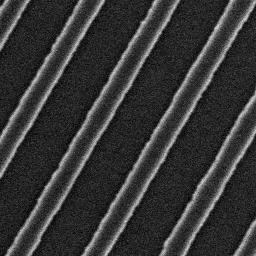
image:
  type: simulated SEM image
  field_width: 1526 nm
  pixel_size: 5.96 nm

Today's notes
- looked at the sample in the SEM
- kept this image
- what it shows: lines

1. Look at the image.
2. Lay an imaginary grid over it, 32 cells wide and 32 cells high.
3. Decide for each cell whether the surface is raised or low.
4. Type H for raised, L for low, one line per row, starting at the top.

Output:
HHHLLLLLLLHHHLLLLLLHHHLLLLLLLHHH
HHHLLLLLLHHHLLLLLLLHHHLLLLLLHHHL
HHLLLLLLLHHHLLLLLLHHHLLLLLLHHHHL
HHLLLLLLHHHLLLLLLHHHLLLLLLLHHHLL
HLLLLLLHHHLLLLLLLHHHLLLLLLHHHLLL
LLLLLLLHHHLLLLLLHHHLLLLLLLHHHLLL
LLLLLLHHHLLLLLLLHHHLLLLLLHHHLLLL
LLLLLLHHHLLLLLLHHHLLLLLLLHHHLLLL
LLLLLHHHLLLLLLHHHHLLLLLLHHHLLLLL
LLLLLHHHLLLLLLHHHLLLLLLHHHHLLLLL
LLLLHHHLLLLLLHHHLLLLLLLHHHLLLLLL
LLLHHHLLLLLLLHHHLLLLLLHHHLLLLLLL
LLLHHHLLLLLLHHHLLLLLLLHHHLLLLLLH
LLHHHLLLLLLHHHHLLLLLLHHHLLLLLLLH
LHHHHLLLLLLHHHLLLLLLHHHHLLLLLLHH
LHHHLLLLLLHHHHLLLLLLHHHLLLLLLHHH
HHHLLLLLLLHHHLLLLLLHHHLLLLLLLHHH
HHHLLLLLLHHHLLLLLLLHHHLLLLLLHHHL
HHLLLLLLLHHHLLLLLLHHHLLLLLLLHHHL
HHLLLLLLHHHLLLLLLLHHHLLLLLLHHHLL
HLLLLLLLHHHLLLLLLHHHLLLLLLLHHHLL
HLLLLLLHHHLLLLLLHHHHLLLLLLHHHLLL
LLLLLLHHHLLLLLLLHHHLLLLLLHHHHLLL
LLLLLLHHHLLLLLLHHHLLLLLLLHHHLLLL
LLLLLHHHLLLLLLLHHHLLLLLLHHHLLLLL
LLLLLHHHLLLLLLHHHLLLLLLLHHHLLLLL
LLLLHHHLLLLLLHHHHLLLLLLHHHLLLLLL
LLLHHHLLLLLLLHHHLLLLLLHHHHLLLLLL
LLLHHHLLLLLLHHHHLLLLLLHHHLLLLLLH
LLHHHLLLLLLLHHHLLLLLLHHHLLLLLLLH
LLHHHLLLLLLHHHLLLLLLLHHHLLLLLLHH
LHHHLLLLLLLHHHLLLLLLHHHLLLLLLHHH